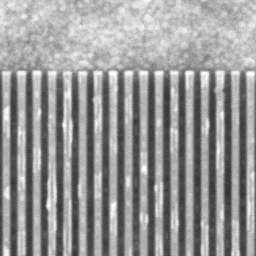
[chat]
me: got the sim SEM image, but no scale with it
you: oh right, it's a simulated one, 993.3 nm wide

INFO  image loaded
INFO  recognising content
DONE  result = parallel lines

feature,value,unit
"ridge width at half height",28.6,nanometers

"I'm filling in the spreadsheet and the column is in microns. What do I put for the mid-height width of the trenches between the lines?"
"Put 0.032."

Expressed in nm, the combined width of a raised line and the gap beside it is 59.2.